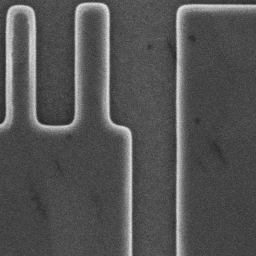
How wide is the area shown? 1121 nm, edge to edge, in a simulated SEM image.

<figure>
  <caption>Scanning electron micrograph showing wiring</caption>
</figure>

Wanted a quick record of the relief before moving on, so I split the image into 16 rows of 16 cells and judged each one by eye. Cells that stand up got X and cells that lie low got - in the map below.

-X---XX----XXXXX
XX---XX----XXXXX
XX---XX----XXXXX
XX---XX----XXXXX
XX---XX----XXXXX
XX---XX----XXXXX
XX---XX----XXXXX
XX--XXX----XXXXX
XXXXXXXX---XXXXX
XXXXXXXX---XXXXX
XXXXXXXX---XXXXX
XXXXXXXX---XXXXX
XXXXXXXX---XXXXX
XXXXXXXX---XXXXX
XXXXXXXX---XXXXX
XXXXXXXX---XXXXX